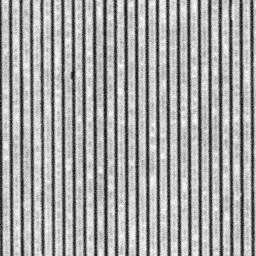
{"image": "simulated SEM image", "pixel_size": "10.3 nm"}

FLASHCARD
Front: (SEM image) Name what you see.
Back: parallel lines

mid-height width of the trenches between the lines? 52.9 nanometres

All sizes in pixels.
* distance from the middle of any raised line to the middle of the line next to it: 10.5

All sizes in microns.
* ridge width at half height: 0.062